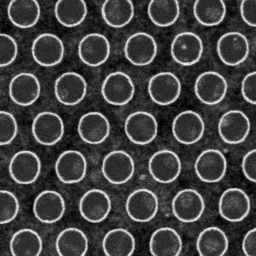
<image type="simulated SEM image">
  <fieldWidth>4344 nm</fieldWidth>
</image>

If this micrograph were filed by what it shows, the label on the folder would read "a regular array of raised bodies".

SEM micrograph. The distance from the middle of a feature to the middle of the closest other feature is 768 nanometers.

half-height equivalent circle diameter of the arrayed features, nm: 517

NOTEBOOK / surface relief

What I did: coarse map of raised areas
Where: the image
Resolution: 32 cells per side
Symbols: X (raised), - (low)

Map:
-XXXX--XXXX--XXX---XXX--XXXX--XX
-XXXX--XXXX--XXXX--XXX--XXXX--XX
-XXXX--XXX---XXX---XXX---XXX---X
--------------------------------
X----XX----XX----XX---XX----XX--
XX--XXXX--XXX---XXX---XXX--XXXX-
XX--XXXX--XXXX--XXX---XXX--XXXX-
XX---XX---XXX---XXX---XXX---XX--
--------------------------------
--XX----XX----XX----XX---XX----X
-XXXX--XXXX--XXX---XXX---XXX--XX
-XXXX--XXXX--XXXX--XXX---XXX--XX
--XX----XX---XXX---XXX---XX----X
--------------------------------
X----XX----XX---XXX---XXX---XXX-
XX--XXXX--XXX---XXX---XXX--XXXX-
XX--XXXX--XXX---XXX---XXX--XXXX-
X----XX----XX----XX---XXX---XX--
--------------------------------
--XX----XX----XX---XXX---XXX---X
-XXXX--XXXX--XXXX--XXX---XXX--XX
-XXXX--XXXX--XXXX--XXX---XXX---X
--XX----XX----XX----X----XX-----
--------------------------------
XX---XX----XX---XXX---XXX---XXX-
XX--XXXX--XXXX--XXXX--XXX---XXX-
XX--XXXX--XXX---XXX---XXX---XXX-
X----XX----XX----X-----X--------
--------------------------------
--XXX--XXXX--XXX---XXX---XXX---X
-XXXX--XXXX--XXXX--XXXX--XXX--XX
--XXX--XXXX--XXX---XXX---XXX---X